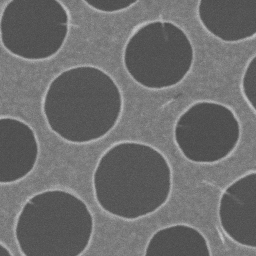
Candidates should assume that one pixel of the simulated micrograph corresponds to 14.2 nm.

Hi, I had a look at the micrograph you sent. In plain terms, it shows holes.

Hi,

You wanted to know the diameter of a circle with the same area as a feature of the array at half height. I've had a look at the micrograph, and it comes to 1020 nm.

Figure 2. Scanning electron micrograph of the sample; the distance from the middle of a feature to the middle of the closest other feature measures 89.7 pixels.